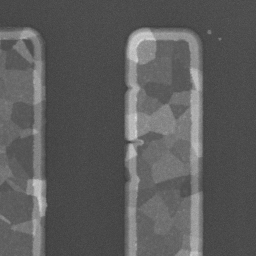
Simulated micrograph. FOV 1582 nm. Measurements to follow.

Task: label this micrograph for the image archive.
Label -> one or a few lines or trenches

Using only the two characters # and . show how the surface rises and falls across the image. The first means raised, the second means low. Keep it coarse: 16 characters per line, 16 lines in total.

................
................
##.......###....
##......####....
##......####....
##......####....
##......####....
##......####....
##......####....
##......####....
##......####....
##......####....
##......####....
##......####....
##......####....
##......####....